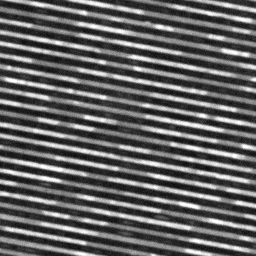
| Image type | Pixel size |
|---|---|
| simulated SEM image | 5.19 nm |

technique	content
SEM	parallel lines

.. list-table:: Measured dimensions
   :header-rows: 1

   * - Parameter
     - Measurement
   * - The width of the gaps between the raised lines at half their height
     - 6.99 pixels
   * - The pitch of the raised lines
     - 11.3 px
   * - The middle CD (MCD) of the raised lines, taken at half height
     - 3.93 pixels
